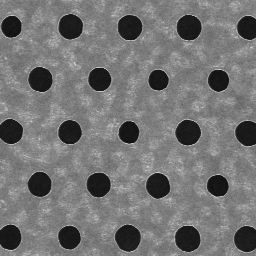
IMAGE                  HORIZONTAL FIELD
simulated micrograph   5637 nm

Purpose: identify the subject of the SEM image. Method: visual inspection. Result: a regular array of holes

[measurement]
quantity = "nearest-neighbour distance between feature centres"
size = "1300 nm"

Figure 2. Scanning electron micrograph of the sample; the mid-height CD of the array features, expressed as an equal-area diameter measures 542 nanometres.